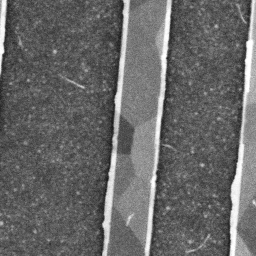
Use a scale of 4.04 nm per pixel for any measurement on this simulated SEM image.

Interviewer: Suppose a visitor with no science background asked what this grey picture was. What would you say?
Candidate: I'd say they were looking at one or a few lines or trenches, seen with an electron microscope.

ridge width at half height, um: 0.186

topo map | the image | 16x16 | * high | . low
........***.....
........***.....
........**......
........**.....*
.......***.....*
.......***.....*
.......***.....*
.......***.....*
.......***.....*
.......***.....*
.......***.....*
.......***.....*
.......***....**
.......**.....**
......***.....**
......***.....**